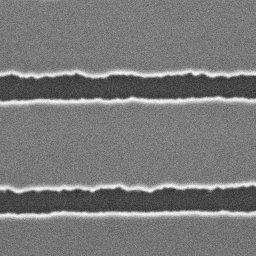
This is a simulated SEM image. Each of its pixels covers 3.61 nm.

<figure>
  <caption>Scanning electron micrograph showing lines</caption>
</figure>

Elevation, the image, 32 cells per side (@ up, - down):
@@@@@@@@@@@@@@@@@@@@@@@@@@@@@@@@
@@@@@@@@@@@@@@@@@@@@@@@@@@@@@@@@
@@@@@@@@@@@@@@@@@@@@@@@@@@@@@@@@
@@@@@@@@@@@@@@@@@@@@@@@@@@@@@@@@
@@@@@@@@@@@@@@@@@@@@@@@@@@@@@@@@
@@@@@@@@@@@@@@@@@@@@@@@@@@@@@@@@
@@@@@@@@@@@@@@@@@@@@@@@@@@@@@@@@
@@@@@@@@@@@@@@@@@@@@@@@@@@@@@@@@
@@@@@@@@@@@@@@@@@@@@@@@@@@@@@@@@
--@@@@@----@@----@@@------@-@---
--------------------------------
--------------------------------
----@@----@@@-@@@@@@@@@@@@@@@@@@
@@@@@@@@@@@@@@@@@@@@@@@@@@@@@@@@
@@@@@@@@@@@@@@@@@@@@@@@@@@@@@@@@
@@@@@@@@@@@@@@@@@@@@@@@@@@@@@@@@
@@@@@@@@@@@@@@@@@@@@@@@@@@@@@@@@
@@@@@@@@@@@@@@@@@@@@@@@@@@@@@@@@
@@@@@@@@@@@@@@@@@@@@@@@@@@@@@@@@
@@@@@@@@@@@@@@@@@@@@@@@@@@@@@@@@
@@@@@@@@@@@@@@@@@@@@@@@@@@@@@@@@
@@@@@@@@@@@@@@@@@@@@@@@@@@@@@@@@
@@@@@@@@@@@@@@@@@@@@@@@@@@@@@@@@
@@@@@@@@@@@@@--@@@@@@-@@--@-----
--------------------------------
--------------------------------
----------------------@@@--@@---
@@@@@@@@@@@@@@@@@@@@@@@@@@@@@@@@
@@@@@@@@@@@@@@@@@@@@@@@@@@@@@@@@
@@@@@@@@@@@@@@@@@@@@@@@@@@@@@@@@
@@@@@@@@@@@@@@@@@@@@@@@@@@@@@@@@
@@@@@@@@@@@@@@@@@@@@@@@@@@@@@@@@